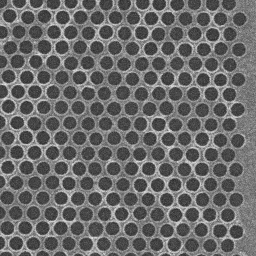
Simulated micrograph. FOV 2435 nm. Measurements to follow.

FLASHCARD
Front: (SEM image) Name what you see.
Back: a regular array of holes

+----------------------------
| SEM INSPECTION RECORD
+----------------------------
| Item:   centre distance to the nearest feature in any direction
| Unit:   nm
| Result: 159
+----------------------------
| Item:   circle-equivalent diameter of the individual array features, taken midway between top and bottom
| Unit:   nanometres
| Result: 136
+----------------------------